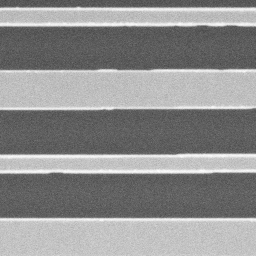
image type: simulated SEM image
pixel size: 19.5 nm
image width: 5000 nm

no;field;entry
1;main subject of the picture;lines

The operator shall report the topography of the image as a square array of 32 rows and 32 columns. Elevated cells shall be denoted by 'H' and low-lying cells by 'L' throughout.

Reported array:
LLLLLLLLLLLLLLLLLLLLLLLLLLLLLLLL
HHHHHHHHHHHHHHHHHHHHHHHHHHHHHHHH
HHHHHHHHHHHHHHHHHHHHHHHHHHHHHHHH
LLLLLLLLLLLLLLLLLLLLLLLLLLLLLLLL
LLLLLLLLLLLLLLLLLLLLLLLLLLLLLLLL
LLLLLLLLLLLLLLLLLLLLLLLLLLLLLLLL
LLLLLLLLLLLLLLLLLLLLLLLLLLLLLLLL
LLLLLLLLLLLLLLLLLLLLLLLLLLLLLLLL
LLLLLLLLLLLLLLLLLLLLLLLLLLLLLLLL
HHHHHHHHHHHHHHHHHHHHHHHHHHHHHHHH
HHHHHHHHHHHHHHHHHHHHHHHHHHHHHHHH
HHHHHHHHHHHHHHHHHHHHHHHHHHHHHHHH
HHHHHHHHHHHHHHHHHHHHHHHHHHHHHHHH
HHHHHHHHHHHHHHHHHHHHHHHHHHHHHHHH
LLLLLLLLLLLLLLLLLLLLLLLLLLLLLLLL
LLLLLLLLLLLLLLLLLLLLLLLLLLLLLLLL
LLLLLLLLLLLLLLLLLLLLLLLLLLLLLLLL
LLLLLLLLLLLLLLLLLLLLLLLLLLLLLLLL
LLLLLLLLLLLLLLLLLLLLLLLLLLLLLLLL
LHHHHHHHHHHHHHHHHHHHHHHHHHHHHHHH
HHHHHHHHHHHHHHHHHHHHHHHHHHHHHHHH
HHHHHLLLHHHHHHHHHLLLHHLLLHLLLLLL
LLLLLLLLLLLLLLLLLLLLLLLLLLLLLLLL
LLLLLLLLLLLLLLLLLLLLLLLLLLLLLLLL
LLLLLLLLLLLLLLLLLLLLLLLLLLLLLLLL
LLLLLLLLLLLLLLLLLLLLLLLLLLLLLLLL
LLLLLLLLLLLLLLLLLLLLLLLLLLLLLLLL
HHHHHHHHHHHHHHHHHHHHHHHHHHHHHHHH
HHHHHHHHHHHHHHHHHHHHHHHHHHHHHHHH
HHHHHHHHHHHHHHHHHHHHHHHHHHHHHHHH
HHHHHHHHHHHHHHHHHHHHHHHHHHHHHHHH
HHHHHHHHHHHHHHHHHHHHHHHHHHHHHHHH